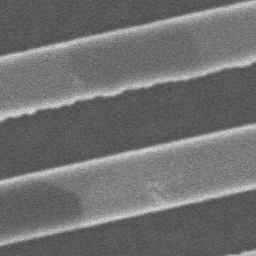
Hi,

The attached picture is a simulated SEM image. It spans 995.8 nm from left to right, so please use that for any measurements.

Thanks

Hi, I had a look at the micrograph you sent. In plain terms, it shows one or a few lines or trenches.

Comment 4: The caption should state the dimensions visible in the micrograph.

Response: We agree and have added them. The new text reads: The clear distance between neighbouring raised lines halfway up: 238 nanometres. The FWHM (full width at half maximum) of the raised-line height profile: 240 nanometres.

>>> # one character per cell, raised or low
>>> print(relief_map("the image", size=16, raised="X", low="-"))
--------------XX
---------XXXXXXX
-----XXXXXXXXXXX
XXXXXXXXXXXXXXXX
XXXXXXXXXXXXX---
XXXXXXXX--------
XXXX------------
----------------
-------------XXX
--------XXXXXXXX
----XXXXXXXXXXXX
XXXXXXXXXXXXXXXX
XXXXXXXXXXXXX---
XXXXXXXX--------
XXXX------------
----------------